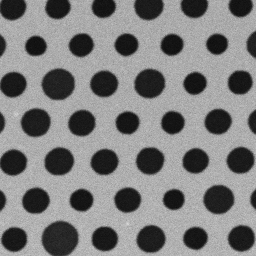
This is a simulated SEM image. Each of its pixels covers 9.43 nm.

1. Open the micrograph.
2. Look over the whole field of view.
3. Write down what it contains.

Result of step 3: a regular array of holes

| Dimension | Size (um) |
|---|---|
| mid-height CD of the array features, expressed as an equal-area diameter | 0.247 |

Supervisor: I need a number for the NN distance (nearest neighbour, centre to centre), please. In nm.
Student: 421